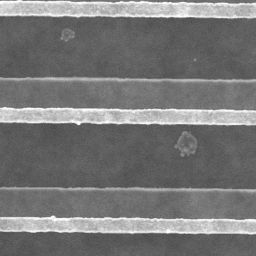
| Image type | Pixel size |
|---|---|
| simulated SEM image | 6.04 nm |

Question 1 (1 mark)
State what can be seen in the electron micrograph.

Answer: lines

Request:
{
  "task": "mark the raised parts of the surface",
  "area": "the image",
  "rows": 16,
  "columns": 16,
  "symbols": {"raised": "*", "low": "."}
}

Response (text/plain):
****************
................
................
................
................
****************
****************
****************
................
................
................
................
****************
****************
....************
................